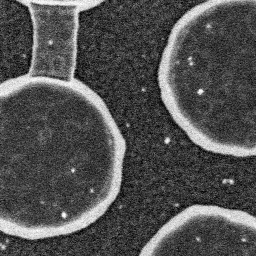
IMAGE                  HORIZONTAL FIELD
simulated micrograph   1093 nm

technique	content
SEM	raised bodies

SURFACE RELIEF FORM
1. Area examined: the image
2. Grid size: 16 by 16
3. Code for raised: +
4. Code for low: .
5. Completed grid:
..+++.......++++
..+++......+++++
..+++......+++++
..+++.....++++++
..+++.....++++++
+++++.....++++++
++++++.....+++++
+++++++....+++++
+++++++.....++++
++++++++.......+
+++++++.........
+++++++.........
+++++++.........
++++++.....++++.
.+++......++++++
.........+++++++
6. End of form